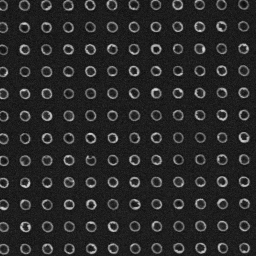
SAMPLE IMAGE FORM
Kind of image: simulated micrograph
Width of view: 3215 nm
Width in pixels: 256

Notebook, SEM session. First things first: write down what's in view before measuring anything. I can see a regular array of raised bodies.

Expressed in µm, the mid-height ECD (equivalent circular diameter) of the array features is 0.128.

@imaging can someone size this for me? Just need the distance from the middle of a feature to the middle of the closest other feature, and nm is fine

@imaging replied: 270